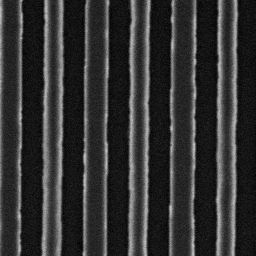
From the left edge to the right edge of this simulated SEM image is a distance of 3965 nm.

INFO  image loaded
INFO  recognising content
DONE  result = lines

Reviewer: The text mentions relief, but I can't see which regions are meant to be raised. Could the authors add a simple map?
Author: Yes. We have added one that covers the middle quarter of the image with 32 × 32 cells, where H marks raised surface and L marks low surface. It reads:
LLLLLHHHHHHLLLLLLHHHHLLLLLLHHHHH
LLLLLHHHHHHLLLLLLHHHHLLLLLLHHHHH
LLLLLHHHHHHLLLLLLHHHHLLLLLLHHHHH
LLLLLHHHHHHLLLLLLHHHHLLLLLLHHHHH
LLLLLHHHHHHLLLLLLHHHHLLLLLLHHHHH
LLLLLHHHHHHLLLLLLHHHHLLLLLLHHHHH
LLLLLHHHHHHLLLLLLHHHHLLLLLLHHHHH
LLLLLHHHHHHLLLLLLHHHHLLLLLLHHHHH
LLLLLHHHHHHLLLLLLHHHHLLLLLLHHHHH
LLLLLHHHHHHLLLLLLHHHHLLLLLLHHHHH
LLLLLHHHHHHLLLLLLHHHHLLLLLLHHHHH
LLLLLHHHHHHLLLLLLHHHHLLLLLLHHHHH
LLLLLHHHHHHLLLLLLHHHHLLLLLLHHHHH
LLLLLHHHHHHLLLLLLHHHHLLLLLLHHHHH
LLLLLHHHHHHLLLLLLHHHHLLLLLLHHHHH
LLLLLHHHHHLLLLLLLHHHHLLLLLLHHHHH
LLLLLHHHHHLLLLLLLHHHHLLLLLLHHHHH
LLLLLHHHHHLLLLLLLHHHHLLLLLLHHHHH
LLLLLHHHHHLLLLLLLHHHHLLLLLLHHHHH
LLLLLHHHHHHLLLLLLHHHHLLLLLLHHHHH
LLLLLHHHHHHLLLLLLHHHHLLLLLLHHHHH
LLLLLHHHHHHLLLLLLHHHHLLLLLLHHHHH
LLLLLHHHHHHLLLLLLHHHHLLLLLLHHHHH
LLLLLHHHHHHLLLLLLHHHHLLLLLLHHHHH
LLLLLHHHHHHLLLLLLHHHHLLLLLLHHHHH
LLLLLHHHHHHLLLLLLHHHHLLLLLLHHHHH
LLLLLHHHHHHLLLLLLHHHHLLLLLLHHHHH
LLLLLHHHHHHLLLLLLHHHHLLLLLLHHHHH
LLLLLHHHHHLLLLLLLHHHHLLLLLLHHHHH
LLLLLHHHHHLLLLLLLHHHHLLLLLLHHHHH
LLLLLHHHHHLLLLLLLHHHHLLLLLLHHHHH
LLLLLHHHHHLLLLLLLHHHHLLLLLLHHHHH